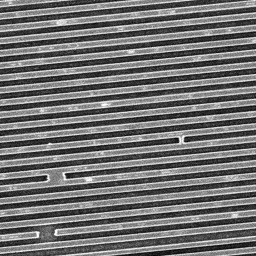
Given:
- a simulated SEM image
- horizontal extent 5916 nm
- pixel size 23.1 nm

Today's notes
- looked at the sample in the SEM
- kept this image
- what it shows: parallel lines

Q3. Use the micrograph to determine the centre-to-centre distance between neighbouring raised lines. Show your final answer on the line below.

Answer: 284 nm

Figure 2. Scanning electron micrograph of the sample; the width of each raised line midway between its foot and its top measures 5.97 pixels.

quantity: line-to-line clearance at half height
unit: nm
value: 138